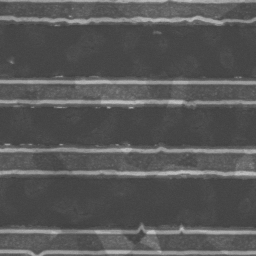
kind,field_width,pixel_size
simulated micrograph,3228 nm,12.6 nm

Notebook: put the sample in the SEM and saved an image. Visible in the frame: one or a few lines or trenches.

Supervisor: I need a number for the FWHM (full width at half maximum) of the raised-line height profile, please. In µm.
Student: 0.265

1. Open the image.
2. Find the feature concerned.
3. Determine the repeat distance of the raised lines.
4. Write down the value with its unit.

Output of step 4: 951 nm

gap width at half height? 0.738 micrometres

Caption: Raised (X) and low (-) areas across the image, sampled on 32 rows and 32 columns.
XXXXXXXXXXXXXXXXXXXXXXXXXXXXXXXX
XXXXXXXXXXXXXXXXXXXXXXXXXXXXXXXX
------X-XXX-X--------X-X--XXXXXX
--------------------------------
--------------------------------
--------------------------------
--------------------------------
--------------------------------
--------------------------------
--------------------------------
XXXXXXXXXXXXXXXXXXXXXXXXXXXXXXXX
XXXXXXXXXXXXXXXXXXXXXXXXXXXXXXXX
XXXXXXXXXXXXXXXXXXXXXXXXXXXXXXXX
--------------------------------
--------------------------------
--------------------------------
--------------------------------
--------------------------------
--------------------------------
XXXXXXXXXXXXXXXXXXXXXXXXXXXXXXXX
XXXXXXXXXXXXXXXXXXXXXXXXXXXXXXXX
XXXXXXXXXXXXXXXXXXXXXXXXXXXXXXXX
--------------------------------
--------------------------------
--------------------------------
--------------------------------
--------------------------------
--------------------------------
--------------------------------
XXXXXXXXXXXXXXXXXXXXXXXXXXXXXXXX
XXXXXXXXXXXXXXXXXXXXXXXXXXXXXXXX
---XXXX-XXXXX-----XXXXXXXXXXXXXX